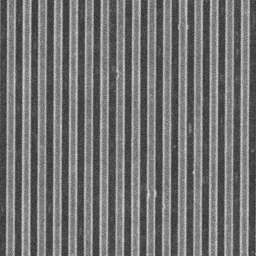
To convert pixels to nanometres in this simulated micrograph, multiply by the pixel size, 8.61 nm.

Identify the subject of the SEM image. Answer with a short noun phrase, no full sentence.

parallel lines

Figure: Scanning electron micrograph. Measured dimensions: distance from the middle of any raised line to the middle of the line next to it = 15.6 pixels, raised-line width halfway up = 68.8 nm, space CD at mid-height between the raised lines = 0.0688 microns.